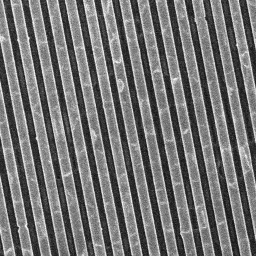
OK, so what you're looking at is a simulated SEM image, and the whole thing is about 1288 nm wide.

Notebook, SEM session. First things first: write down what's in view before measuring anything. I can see parallel lines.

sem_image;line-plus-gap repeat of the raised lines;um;0.0897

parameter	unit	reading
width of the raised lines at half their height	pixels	9.58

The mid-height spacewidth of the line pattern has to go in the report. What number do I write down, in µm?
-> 0.0402